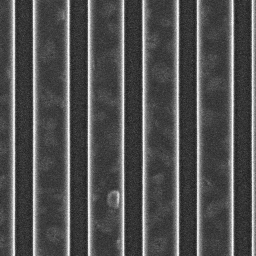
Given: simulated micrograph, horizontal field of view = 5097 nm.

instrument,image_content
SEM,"parallel lines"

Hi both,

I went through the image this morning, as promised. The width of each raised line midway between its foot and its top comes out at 697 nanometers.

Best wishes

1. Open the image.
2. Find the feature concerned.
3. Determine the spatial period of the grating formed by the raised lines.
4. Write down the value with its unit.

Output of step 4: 1080 nm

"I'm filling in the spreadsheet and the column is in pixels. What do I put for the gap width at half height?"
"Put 19.7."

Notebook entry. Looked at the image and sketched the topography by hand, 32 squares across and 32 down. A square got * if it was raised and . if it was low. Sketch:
**..*****..****...****...****...
**..*****..****...****...****...
**..*****..****...****...****...
**..*****..****...****...****...
**..*****..****...****...****...
**..*****..****...****...****...
**..*****..****...****...****...
**..*****..****...****...****...
**..*****..****...****...****...
**..*****..****...****...****...
**..*****..****...****...****...
**..*****..****...****...****...
**..*****..****...****...****...
**..*****..****...****...****...
**..*****..****...****...****...
**..*****..****...****...****...
**..*****..****...****...****...
**..*****..****...****...****...
**..*****..****...****...****...
**..*****..****...****...****...
**..*****..****...****...****...
**..*****..****...****...****...
**..*****..****...****...****...
**..*****..****...****...****...
**..*****..****...****...****...
**..*****..****...****...****...
**..*****..****...****...****...
**..*****..****...****...****...
**..*****..****...****...****...
**..*****..****...****...****...
**..*****..****...****...****...
**..*****..****...****...****...